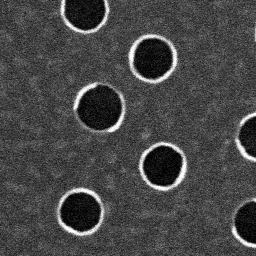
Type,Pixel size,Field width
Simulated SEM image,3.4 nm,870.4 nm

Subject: holes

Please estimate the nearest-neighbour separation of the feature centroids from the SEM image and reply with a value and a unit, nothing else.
268 nm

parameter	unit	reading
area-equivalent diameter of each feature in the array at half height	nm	138